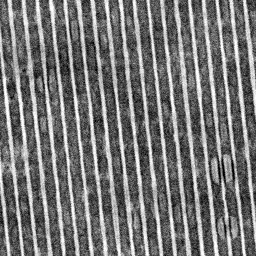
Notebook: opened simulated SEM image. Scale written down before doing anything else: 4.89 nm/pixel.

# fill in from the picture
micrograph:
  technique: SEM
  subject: parallel lines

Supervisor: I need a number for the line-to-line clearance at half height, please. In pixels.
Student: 10.5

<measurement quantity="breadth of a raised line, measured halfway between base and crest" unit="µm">0.017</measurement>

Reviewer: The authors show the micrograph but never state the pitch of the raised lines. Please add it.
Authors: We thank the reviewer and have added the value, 67.4 nanometers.